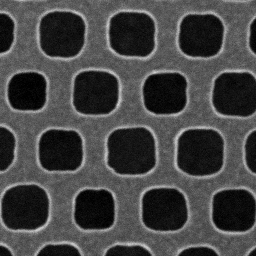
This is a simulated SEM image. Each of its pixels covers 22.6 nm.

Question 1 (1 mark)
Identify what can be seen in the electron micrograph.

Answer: a regular array of holes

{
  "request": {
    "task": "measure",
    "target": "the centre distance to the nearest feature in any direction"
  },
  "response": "1.52 µm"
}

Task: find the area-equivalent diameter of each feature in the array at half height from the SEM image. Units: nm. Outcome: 1080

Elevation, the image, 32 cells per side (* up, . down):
********************************
******...******..***************
..***.....****.....****.....****
..***......***.....***......***.
..***......***.....***......***.
..***......***.....***......***.
.****.....*****....****....*****
********************************
********************************
**...*****....*****....****.....
*.....***......***.....****.....
*.....***......***.....****.....
*.....***......***.....***......
**...****.....****.....****.....
*****************************..*
********************************
.*****....****.....****....*****
..***.....***......***......***.
..***.....****.....***......***.
..***.....***......***......***.
.****.....***......***......***.
**************.....****....*****
********************************
*....***************..**********
......****....****.....****.....
......***.....****.....****.....
......***.....****.....***......
......***.....****.....****.....
*....*****....*****....****....*
********************************
********************************
.****.....***......****....****.